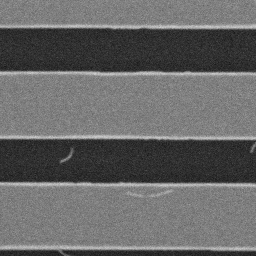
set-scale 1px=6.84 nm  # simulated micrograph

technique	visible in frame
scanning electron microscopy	lines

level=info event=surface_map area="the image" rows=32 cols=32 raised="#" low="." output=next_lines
################################
################################
################################
................................
................................
................................
................................
................................
................................
################################
################################
################################
################################
################################
################################
################################
################################
................................
................................
................................
................................
................................
................................
################################
################################
################################
################################
################################
################################
################################
################################
................................